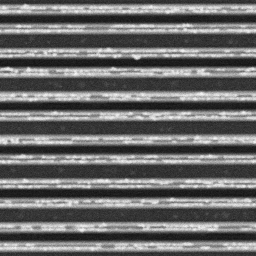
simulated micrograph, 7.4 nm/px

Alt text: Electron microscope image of parallel lines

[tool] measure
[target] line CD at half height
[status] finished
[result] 68.5 nm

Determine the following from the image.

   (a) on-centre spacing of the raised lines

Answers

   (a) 159 nm